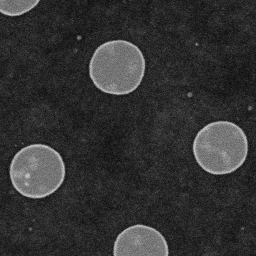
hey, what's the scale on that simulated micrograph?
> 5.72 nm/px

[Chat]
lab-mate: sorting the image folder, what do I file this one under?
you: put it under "raised bodies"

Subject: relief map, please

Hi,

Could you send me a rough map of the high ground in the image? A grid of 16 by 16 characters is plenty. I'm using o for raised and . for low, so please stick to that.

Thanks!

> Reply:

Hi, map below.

oo..............
................
................
......ooo.......
......ooo.......
......oo........
................
................
............ooo.
.oo.........ooo.
.ooo.........oo.
.ooo............
................
................
........oo......
.......ooo......